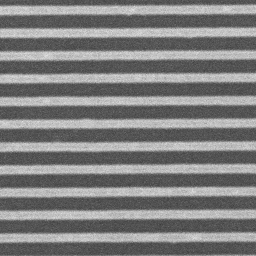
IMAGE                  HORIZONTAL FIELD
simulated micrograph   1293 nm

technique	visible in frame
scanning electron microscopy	parallel lines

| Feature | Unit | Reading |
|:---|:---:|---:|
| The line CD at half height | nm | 38.5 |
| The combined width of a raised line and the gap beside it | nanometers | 115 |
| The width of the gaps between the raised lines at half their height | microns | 0.0777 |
